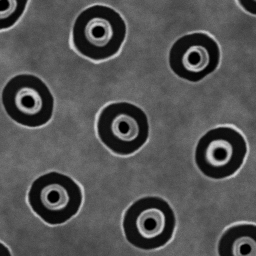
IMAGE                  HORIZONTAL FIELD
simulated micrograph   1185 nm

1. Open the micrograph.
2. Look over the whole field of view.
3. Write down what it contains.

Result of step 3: ring-shaped grooves with a dot in the middle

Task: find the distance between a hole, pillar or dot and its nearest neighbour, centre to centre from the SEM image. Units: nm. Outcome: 450